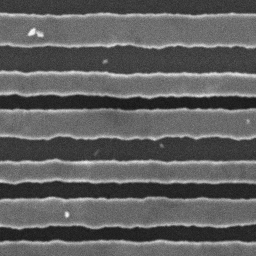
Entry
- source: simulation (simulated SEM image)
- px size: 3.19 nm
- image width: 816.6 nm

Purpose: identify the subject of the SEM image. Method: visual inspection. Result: lines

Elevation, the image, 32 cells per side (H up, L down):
LLLLLLLLLLLLLLLLLLLLLLLLLLLLLLLL
LLLLLLLLLLLLLLLLLLLLLLLLLLLLLLLL
HHHHHHHHHHHHHHHHHHHHHHHHHHHHHHHH
HHHHHHHHHHHHHHHHHHHHHHHHHHHHHHHH
HHHHHHHHHHHHHHHHHHHHHHHHHHHHHHHH
HHHHHHHHHHHHHHHHHHHHHHHHHHHHHHHH
LLLLLLLLLLLLLLLLLLLLLLLLLLLLLLLL
LLLLLLLLLLLLLLLLLLLLLLLLLLLLLLLL
LLLLLLLLLLLLLLLLLLLLLLLLLLLLLLLL
HHHHHHHHHHHHHHHHHHHHHHHHHHHHHHHH
HHHHHHHHHHHHHHHHHHHHHHHHHHHHHHHH
HHHHHHHHHHHHHHHHHHHHHHHHHHHHHHHH
LLLLLLLLLLLLLLLLLLLLLLLLLLLLLLLL
LLLLLLLLLLLLLLLLLLLLLLLLLLLLLLLL
HHHHHHHHHHHHHHHHHHHHHHHHHHHHHHHH
HHHHHHHHHHHHHHHHHHHHHHHHHHHHHHHH
HHHHHHHHHHHHHHHHHHHHHHHHHHHHHHHH
LLLLLLLLLLLLLLLLLLLLLLLLLLLLLLLL
LLLLLLLLLLLLLLLLLLLLLLLLLLLLLLLL
LLLLLLLLLLLLLLLLLLLLLLLLLLLLLLLL
HHHHHHHHHHHHHHHHHHHHHHHHHHHHHHHH
HHHHHHHHHHHHHHHHHHHHHHHHHHHHHHHH
HHHHHHHHHHHHHHHHHHHHHHHHHHHHHHHH
LLLLLLLLLLLLLLLLLLLLLLLLLLLLLLLL
LLLLLLLLLLLLLLLLLLLLLLLLLLLLLLLL
HHHHHHHHHHHHHHHHHHHHHHHHHHHHHHHH
HHHHHHHHHHHHHHHHHHHHHHHHHHHHHHHH
HHHHHHHHHHHHHHHHHHHHHHHHHHHHHHHH
LHHLLLLLLLLHHLLLLLLLLLLLLLLLLLLL
LLLLLLLLLLLLLLLLLLLLLLLLLLLLLLLL
HHHHHHHHHHHHHHHHHHHHHHHHHHHHHHHH
HHHHHHHHHHHHHHHHHHHHHHHHHHHHHHHH